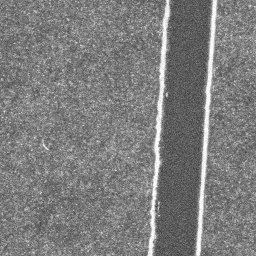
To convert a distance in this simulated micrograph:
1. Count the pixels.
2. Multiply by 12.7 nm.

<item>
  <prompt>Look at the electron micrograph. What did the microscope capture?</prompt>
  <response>one or a few lines or trenches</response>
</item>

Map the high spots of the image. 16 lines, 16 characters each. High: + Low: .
++++++++++...+++
++++++++++...+++
++++++++++...+++
++++++++++...+++
++++++++++...+++
++++++++++...+++
++++++++++...+++
++++++++++...+++
++++++++++...+++
++++++++++...+++
++++++++++...+++
++++++++++...+++
++++++++++...+++
++++++++++...+++
++++++++++..++++
+++++++++...++++